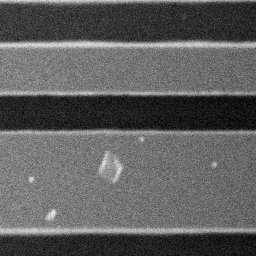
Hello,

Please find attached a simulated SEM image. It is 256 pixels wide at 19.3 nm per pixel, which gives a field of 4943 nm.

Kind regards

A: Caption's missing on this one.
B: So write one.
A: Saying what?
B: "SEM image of lines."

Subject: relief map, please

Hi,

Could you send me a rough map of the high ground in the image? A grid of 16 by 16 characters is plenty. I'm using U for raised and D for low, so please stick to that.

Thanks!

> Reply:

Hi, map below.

DDDDDDDDDDDDDDDD
DDDDDDDDDDDDDDDD
DDDDDDDDDDDDDDDD
UUUUUUUUUUUUUUUU
UUUUUUUUUUUUUUUU
UUUUUUUUUUUUUUUU
DDDDDDDDDDDDDDDD
DDDDDDDDDDDDDDDD
UUUUUUUUUUUUUUUU
UUUUUUUUUUUUUUUU
UUUUUUUUUUUUUUUU
UUUUUUUUUUUUUUUU
UUUUUUUUUUUUUUUU
UUUUUUUUUUUUUUUU
DDDDDDDDDDDDDDDD
DDDDDDDDDDDDDDDD